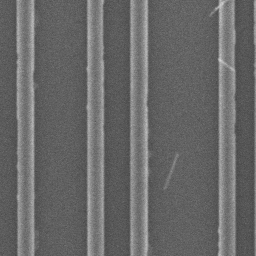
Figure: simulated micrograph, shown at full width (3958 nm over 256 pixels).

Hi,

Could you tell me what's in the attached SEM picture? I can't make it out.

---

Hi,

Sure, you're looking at lines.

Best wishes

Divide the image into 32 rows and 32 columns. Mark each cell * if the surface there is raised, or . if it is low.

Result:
..**.......**...**.........**...
..**.......**...**.........**...
..**.......**...**.........**...
..**.......**...**.........**...
..**.......**...**.........**...
..**.......**...**.........**...
..**.......**...**.........**...
..**.......**...**.........**...
..**.......**...**.........**...
..**.......**...**.........**...
..**.......**...**.........**...
..**.......**...**.........**...
..**.......**...**.........**...
..**.......**...**.........**...
..**.......**...**.........**...
..**.......**...**.........**...
..**.......**...**.........**...
..**.......**...**.........**...
..**.......**...**.........**...
..**.......**...**.........**...
..**.......**...**.........**...
..**.......**...**.........**...
..**.......**...**.........**...
..**.......**...**.........**...
..**.......**...**.........**...
..**.......**...**.........**...
..**.......**...**.........**...
..**.......**...**.........**...
..**.......**...**.........**...
..**.......**...**.........**...
..**.......**...**.........**...
..**.......**...**.........**...